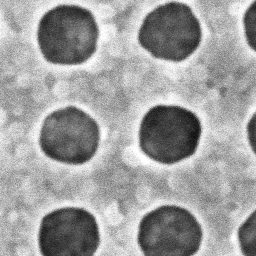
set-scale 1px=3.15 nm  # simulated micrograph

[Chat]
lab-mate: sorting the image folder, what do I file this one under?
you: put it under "holes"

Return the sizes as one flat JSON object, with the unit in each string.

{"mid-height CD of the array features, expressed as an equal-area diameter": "62.1 pixels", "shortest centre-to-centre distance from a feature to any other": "100 px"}